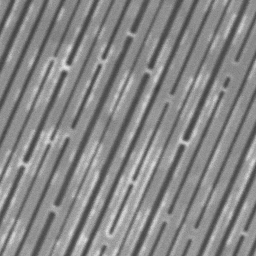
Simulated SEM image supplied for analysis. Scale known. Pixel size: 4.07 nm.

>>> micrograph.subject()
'parallel lines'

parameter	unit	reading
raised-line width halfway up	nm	39.1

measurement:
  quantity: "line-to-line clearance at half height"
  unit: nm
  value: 19.6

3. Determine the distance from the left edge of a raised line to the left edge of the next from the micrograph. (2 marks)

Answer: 0.0621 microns